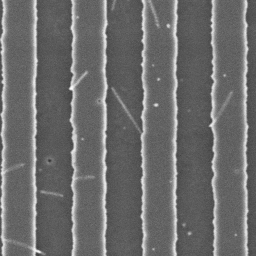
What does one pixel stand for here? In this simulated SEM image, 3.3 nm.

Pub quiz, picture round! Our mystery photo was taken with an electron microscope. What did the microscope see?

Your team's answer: lines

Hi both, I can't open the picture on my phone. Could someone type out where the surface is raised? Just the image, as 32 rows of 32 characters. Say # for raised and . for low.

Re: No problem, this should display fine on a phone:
####.....####.....####.....####.
#####....####.....####.....####.
#####....####.....####.....####.
####.....####.....####.....####.
####.....####.....####....#####.
####.....####.....####.....####.
####.....####.....####.....####.
#####....####.....####.....####.
####.....####.....####.....####.
####.....####.....####.....####.
####.....####.....####.....####.
####.....####.....####....#####.
####.....####.....####.....####.
####.....####.....####.....####.
####.....####.....####....#####.
####.....####.....####....#####.
####.....####.....####.....####.
####.....####.....####.....####.
####.....####.....####.....####.
####.....####.....####.....####.
####.....####.....####.....####.
####.....####.....####.....####.
####.....####.....####.....####.
####.....####.....####.....####.
####.....####.....####.....####.
####.....####.....####.....####.
####.....####.....####.....####.
####.....####.....####.....####.
####.....####.....####.....####.
####.....####.....####.....####.
####.....####.....####.....####.
####.....####.....####.....####.